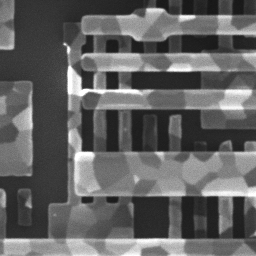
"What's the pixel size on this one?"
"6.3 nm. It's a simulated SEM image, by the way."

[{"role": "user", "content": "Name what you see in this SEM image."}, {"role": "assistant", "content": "wiring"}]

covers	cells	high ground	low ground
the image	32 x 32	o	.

................................
.................oooo...........
..........oooooooooooooooooooooo
..........oooooooooooooooooooooo
................ooooo...........
................................
................................
..........oooooooooooooooooooooo
..........oooooooooooooooooooooo
................................
................................
..........oooooooooooooooooooooo
..........oooooooooooooooooooooo
...........ooooooooooooooooooooo
................................
................................
................................
................................
................................
.........ooooooooooooooooooooooo
.........ooooooooooooooooooooooo
.........ooooooooooooooooooooooo
.........ooooooooooooooooooooooo
.........ooooooooooooooooooooooo
.................oo.............
................................
................................
................................
................................
................................
oooooooooooooooooooooooooooooooo
oooooooooooooooooooooooooooooooo